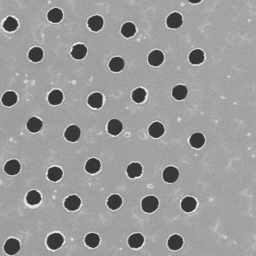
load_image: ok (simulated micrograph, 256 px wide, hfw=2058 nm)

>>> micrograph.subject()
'a regular array of holes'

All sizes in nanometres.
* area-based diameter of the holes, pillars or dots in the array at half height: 126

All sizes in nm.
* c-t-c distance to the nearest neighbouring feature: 294